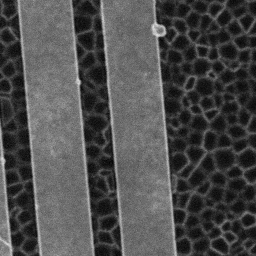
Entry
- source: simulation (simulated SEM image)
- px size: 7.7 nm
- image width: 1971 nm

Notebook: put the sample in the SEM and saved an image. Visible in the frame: one or a few lines or trenches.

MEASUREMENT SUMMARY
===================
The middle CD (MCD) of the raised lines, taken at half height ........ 412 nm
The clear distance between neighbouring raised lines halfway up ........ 219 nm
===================